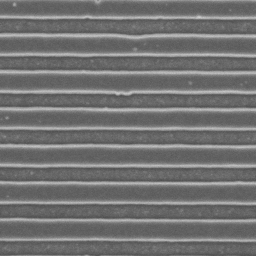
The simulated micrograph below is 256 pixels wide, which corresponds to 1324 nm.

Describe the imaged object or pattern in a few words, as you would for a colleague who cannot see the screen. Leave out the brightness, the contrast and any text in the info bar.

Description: parallel lines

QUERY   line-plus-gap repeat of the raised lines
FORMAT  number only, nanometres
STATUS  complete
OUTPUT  191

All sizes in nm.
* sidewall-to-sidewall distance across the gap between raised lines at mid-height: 85.3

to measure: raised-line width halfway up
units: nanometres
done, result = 106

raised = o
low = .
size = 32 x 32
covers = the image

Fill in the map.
oooooooooooooooooooooooooooooooo
oooooooooooooooooooooooooooooooo
................................
................................
oooooooooooooooo..oooooooooooooo
oooooooooooooooooooooooooooooooo
oooooooooooooooooooooooooooooooo
................................
................................
oooooooooooooooooooooooooooooooo
oooooooooooooooooooooooooooooooo
..oo.......ooooooooooooooooooooo
................................
................................
oooooooooooooooooooooooooooooooo
oooooooooooooooooooooooooooooooo
................................
................................
oooooooooooooooooooooooooooooooo
oooooooooooooooooooooooooooooooo
oooooooooooooooooooooooooooooooo
................................
................................
oooooooooooooooooooooooooooooooo
oooooooooooooooooooooooooooooooo
................................
................................
ooooooooooo.....................
oooooooooooooooooooooooooooooooo
oooooooooooooooooooooooooooooooo
................................
................................